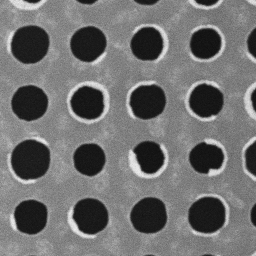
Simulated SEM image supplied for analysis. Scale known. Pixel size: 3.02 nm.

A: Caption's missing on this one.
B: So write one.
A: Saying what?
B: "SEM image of a regular array of holes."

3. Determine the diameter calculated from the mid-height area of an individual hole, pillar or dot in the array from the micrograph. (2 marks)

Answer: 106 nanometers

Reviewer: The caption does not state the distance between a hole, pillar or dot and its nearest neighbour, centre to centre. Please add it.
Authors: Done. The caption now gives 172 nanometres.